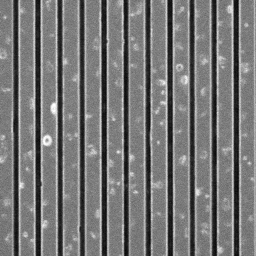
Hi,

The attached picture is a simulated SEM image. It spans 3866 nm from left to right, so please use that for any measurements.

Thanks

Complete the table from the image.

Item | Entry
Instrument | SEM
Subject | parallel lines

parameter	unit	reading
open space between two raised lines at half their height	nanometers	84.9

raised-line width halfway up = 0.253 µm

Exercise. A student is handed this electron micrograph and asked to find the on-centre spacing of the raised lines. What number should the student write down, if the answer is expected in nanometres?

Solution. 332